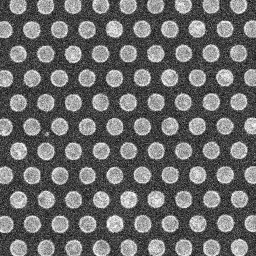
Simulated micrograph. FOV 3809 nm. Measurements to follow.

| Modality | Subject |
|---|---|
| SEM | a regular array of raised bodies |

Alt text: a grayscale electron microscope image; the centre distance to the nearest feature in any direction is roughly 406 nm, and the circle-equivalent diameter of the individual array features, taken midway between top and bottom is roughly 241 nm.